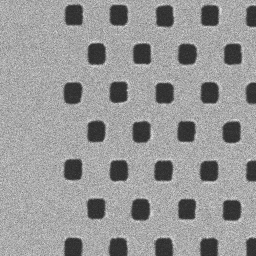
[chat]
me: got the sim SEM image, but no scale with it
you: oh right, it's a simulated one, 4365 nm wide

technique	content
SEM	a regular array of holes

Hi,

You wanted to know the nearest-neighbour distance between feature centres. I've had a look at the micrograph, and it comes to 0.758 µm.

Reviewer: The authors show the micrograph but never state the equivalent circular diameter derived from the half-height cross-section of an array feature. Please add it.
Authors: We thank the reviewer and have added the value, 368 nanometers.